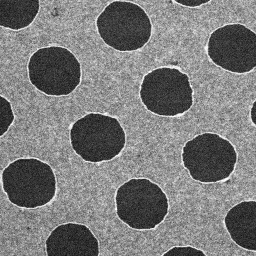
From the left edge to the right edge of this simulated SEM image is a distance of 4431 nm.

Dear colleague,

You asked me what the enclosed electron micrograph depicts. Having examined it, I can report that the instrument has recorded holes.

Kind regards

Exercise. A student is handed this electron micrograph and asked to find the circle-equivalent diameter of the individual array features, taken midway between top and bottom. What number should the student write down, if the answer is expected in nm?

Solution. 907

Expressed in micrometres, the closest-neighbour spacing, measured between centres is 1.37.